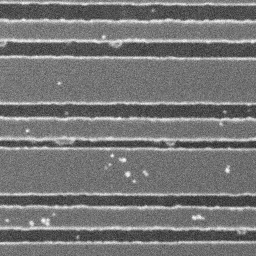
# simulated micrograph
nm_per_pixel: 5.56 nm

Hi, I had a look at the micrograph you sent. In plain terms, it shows lines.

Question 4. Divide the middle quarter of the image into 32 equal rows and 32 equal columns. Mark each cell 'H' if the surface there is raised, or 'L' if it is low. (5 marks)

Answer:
HHHHHHHHHHHHHHHHHHHHHHHHHHHHHHHH
HHHHHHHHHHHHHHHHHHHHHHHHHHHHHHHH
HHHHHHHHHHHHHHHHHHHHHHHHHHHHHHHH
HHHHHHHHHHHHHHHHHHHHHHHHHHHHHHHH
HHHHHHHHHHHHHHHHHHHHHHHHHHHHHHHH
HHHHHHHHHHHHHHHHHHHHHHHHHHHHHHHH
HHHHHHHHHHHHHHHHHHHHHHHHHHHHHHHH
HHHHHHHHHHHHHHHHHHHHHHHHHHHHHHHH
HHHHHHHHHHHHHHHHHHHHHHHHHHHHHHHH
HHHHHHHHHHHHHHHHHHHHHHHHHHHHHHHH
LLLLLLLLLLLLLLLLLLLLLLLLLLLLLLLL
LLLLLLLLLLLLLLLLLLLLLLLLLLLLLLLL
LLLLLLLLLLLLLLLLLLLLLLLLLLLLLLLL
LHHHHHLLHHHHLHLLLLLLLLLLLLLLLLLL
HHHHHHHHHHHHHHHHHHHHHHHHHHHHHHHH
HHHHHHHHHHHHHHHHHHHHHHHHHHHHHHHH
HHHHHHHHHHHHHHHHHHHHHHHHHHHHHHHH
HHHHHHHHHHHHHHHHHHHHHHHHHHHHHHHH
HHHHHHHHHHHHHHHHHHHHHHHHHHHHHHHH
LLLLLLLLLLLLLLLLLLLLLLLLLLLLLLLL
LLLLLLLLLLLLLLLLLLLLLLLLLLLLLLLL
HHHHHHHHHHHHHHHHHHHHHHHHHHHHHHHH
HHHHHHHHHHHHHHHHHHHHHHHHHHHHHHHH
HHHHHHHHHHHHHHHHHHHHHHHHHHHHHHHH
HHHHHHHHHHHHHHHHHHHHHHHHHHHHHHHH
HHHHHHHHHHHHHHHHHHHHHHHHHHHHHHHH
HHHHHHHHHHHHHHHHHHHHHHHHHHHHHHHH
HHHHHHHHHHHHHHHHHHHHHHHHHHHHHHHH
HHHHHHHHHHHHHHHHHHHHHHHHHHHHHHHH
HHHHHHHHHHHHHHHHHHHHHHHHHHHHHHHH
HHHHHHHHHHHHHHHHHHHHHHHHHHHHHHHH
HHHHHHHHHHHHHHHHHHHHHHHHHHHHHHHH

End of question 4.